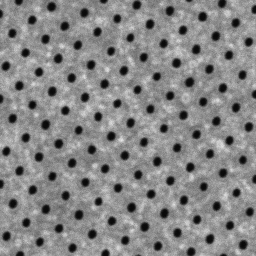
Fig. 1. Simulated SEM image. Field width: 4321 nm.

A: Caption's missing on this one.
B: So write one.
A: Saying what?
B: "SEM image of a regular array of holes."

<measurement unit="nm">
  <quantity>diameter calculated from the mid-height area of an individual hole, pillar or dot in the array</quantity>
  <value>160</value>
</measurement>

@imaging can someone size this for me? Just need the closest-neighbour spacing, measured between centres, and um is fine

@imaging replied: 0.393